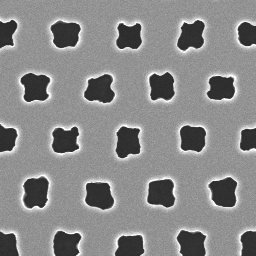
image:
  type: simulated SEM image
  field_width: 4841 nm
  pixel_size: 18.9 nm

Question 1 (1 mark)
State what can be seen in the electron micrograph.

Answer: a regular array of holes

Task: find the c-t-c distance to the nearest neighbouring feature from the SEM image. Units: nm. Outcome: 1130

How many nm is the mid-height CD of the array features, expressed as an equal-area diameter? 534